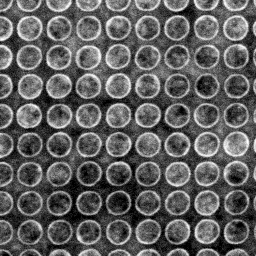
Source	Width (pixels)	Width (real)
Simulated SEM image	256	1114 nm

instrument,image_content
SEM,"a regular array of raised bodies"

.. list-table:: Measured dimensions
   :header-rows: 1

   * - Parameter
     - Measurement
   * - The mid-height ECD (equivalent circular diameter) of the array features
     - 105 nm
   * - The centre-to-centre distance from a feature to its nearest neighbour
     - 28.9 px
